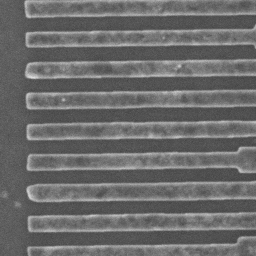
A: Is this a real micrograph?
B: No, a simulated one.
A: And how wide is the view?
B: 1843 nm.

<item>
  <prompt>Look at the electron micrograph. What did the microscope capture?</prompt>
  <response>wiring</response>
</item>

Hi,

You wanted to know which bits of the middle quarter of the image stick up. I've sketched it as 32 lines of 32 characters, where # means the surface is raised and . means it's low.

################################
################################
################################
................................
................................
................................
................................
################################
################################
################################
################################
................................
................................
................................
................................
################################
################################
################################
#############...................
................................
................................
................................
.....................###########
################################
################################
################################
................................
................................
................................
................................
################################
################################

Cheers